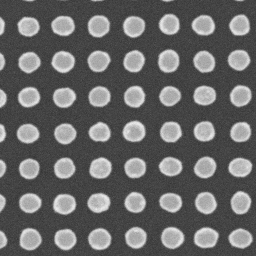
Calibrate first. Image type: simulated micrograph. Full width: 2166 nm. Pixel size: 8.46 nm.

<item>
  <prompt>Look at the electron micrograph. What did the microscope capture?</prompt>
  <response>a regular array of raised bodies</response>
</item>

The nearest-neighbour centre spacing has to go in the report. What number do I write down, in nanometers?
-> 292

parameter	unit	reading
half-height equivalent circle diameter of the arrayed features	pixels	20.4